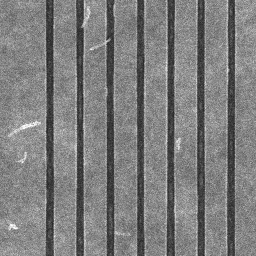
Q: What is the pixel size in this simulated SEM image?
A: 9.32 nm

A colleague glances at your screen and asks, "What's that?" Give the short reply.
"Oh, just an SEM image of parallel lines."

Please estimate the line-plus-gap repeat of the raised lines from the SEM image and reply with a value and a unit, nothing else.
282 nm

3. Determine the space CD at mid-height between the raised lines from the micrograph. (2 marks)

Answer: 74.6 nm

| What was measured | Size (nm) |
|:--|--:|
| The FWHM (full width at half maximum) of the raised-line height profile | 209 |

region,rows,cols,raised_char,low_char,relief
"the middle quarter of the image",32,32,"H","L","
HHHLLHHHHHLLLHHHHHLLHHHHHHLLHHHH
HHHLLHHHHHLLLHHHHHLLHHHHHHLLHHHH
HHHLLHHHHHLLLHHHHHLLHHHHHHLLHHHH
HHHLLHHHHHLLLHHHHHLLHHHHHHLLHHHH
HHHLLHHHHHLLLHHHHHLLHHHHHHLLHHHH
HHHLLHHHHHLLLHHHHHLLHHHHHHLLHHHH
HHHLLHHHHHHLLHHHHHLLHHHHHHLLHHHH
HHHLLHHHHHHLLHHHHHLLHHHHHHLLHHHH
HHHLLHHHHHLLLHHHHHLLHHHHHHLLHHHH
HHHLLHHHHHLLLHHHHHLLHHHHHHLLHHHH
HHHLLHHHHHLLLHHHHHLLHHHHHHLLHHHH
HHHLLHHHHHLLLHHHHHLLHHHHHHLLHHHH
HHHLLHHHHHLLLHHHHHLLHHHHHHLLHHHH
HHHLLHHHHHLLLHHHHHLLHHHHHHLLHHHH
HHHLLHHHHHLLLHHHHHLLHHHHHHLLHHHH
HHHLLHHHHHHLLHHHHHLLHHHHHHLLHHHH
HHHLLHHHHHHLLHHHHHLLHHHHHHLLHHHH
HHHLLHHHHHHLLHHHHHLLHHHHHHLLHHHH
HHHLLHHHHHHLLHHHHHLLHHHHHHLLHHHH
HHHLLHHHHHHLLHHHHHLLHHHHHHLLHHHH
HHHLLHHHHHHLLHHHHHLLHHHHHHLLHHHH
HHHLLHHHHHHLLHHHHHLLHHHHHHLLHHHH
HHHLLHHHHHHLLHHHHHLLHHHHHHLLHHHH
HHHLLHHHHHHLLHHHHHLLHHHHHHLLHHHH
HHHLLHHHHHHLLHHHHHLLHHHHHHLLHHHH
HHHLLHHHHHHLLHHHHHLLHHHHHHLLHHHH
HHHLLHHHHHHLLHHHHHLLHHHHHHLLHHHH
HHHLLHHHHHHLLHHHHHLLHHHHHHLLHHHH
HHHLLHHHHHHLLHHHHHLLHHHHHHLLHHHH
HHHLLHHHHHHLLHHHHHLLHHHHHHLLHHHH
HHHLLHHHHHHLLHHHHHLLHHHHHHLLHHHH
HHHLLHHHHHHLLHHHHHLLHHHHHHLLHHHH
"